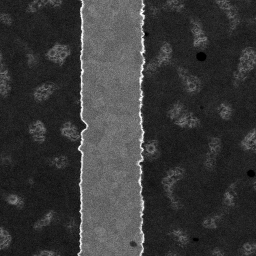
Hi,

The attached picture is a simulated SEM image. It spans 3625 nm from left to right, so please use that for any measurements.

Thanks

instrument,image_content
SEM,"one or a few lines or trenches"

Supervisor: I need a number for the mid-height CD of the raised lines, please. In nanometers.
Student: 856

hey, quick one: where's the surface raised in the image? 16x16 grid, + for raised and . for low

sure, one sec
.....++++.......
.....++++.......
.....++++.......
.....++++.......
.....++++.......
.....++++.......
.....++++.......
.....++++.......
.....++++.......
.....++++.......
.....++++.......
.....++++.......
.....++++.......
.....++++.......
.....++++.......
.....++++.......